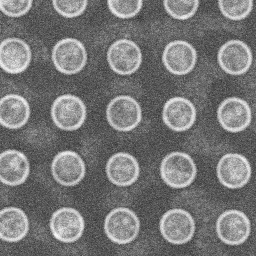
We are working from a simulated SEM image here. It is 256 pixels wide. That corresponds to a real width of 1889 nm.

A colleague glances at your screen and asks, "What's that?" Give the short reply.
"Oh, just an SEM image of a regular array of raised bodies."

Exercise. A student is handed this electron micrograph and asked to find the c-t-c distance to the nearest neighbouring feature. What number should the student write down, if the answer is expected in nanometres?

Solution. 407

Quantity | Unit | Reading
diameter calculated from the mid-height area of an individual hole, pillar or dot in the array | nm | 236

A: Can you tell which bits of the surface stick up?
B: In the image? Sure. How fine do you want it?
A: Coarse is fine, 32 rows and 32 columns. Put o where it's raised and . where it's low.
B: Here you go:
oooo...oooo...ooo....oooo...ooo.
.oo.....oo....ooo....ooo....ooo.
................................
................................
................................
ooo....ooo....ooo.....o.....oo..
oooo...oooo...ooo....ooo....ooo.
oooo...oooo...ooo....ooo...oooo.
.oo....ooo....ooo....ooo....ooo.
................................
................................
................................
ooo....ooo....ooo.....o......o..
ooo....ooo....ooo....ooo....ooo.
ooo....ooo...oooo....ooo...oooo.
ooo....ooo....ooo....ooo....ooo.
................................
................................
................................
ooo....ooo....oo.....oo.....oo..
ooo....ooo....ooo...oooo...oooo.
ooo....ooo...oooo...oooo...oooo.
ooo....ooo....ooo....ooo....ooo.
................................
................................
................................
ooo....oo.....oo.....oo.........
ooo...oooo...oooo...oooo...oooo.
ooo...oooo...oooo...oooo...oooo.
ooo....ooo....ooo....ooo...oooo.
................................
................................